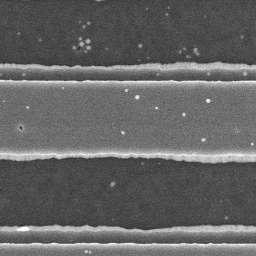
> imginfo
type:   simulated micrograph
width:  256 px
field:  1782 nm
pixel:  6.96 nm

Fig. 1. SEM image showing lines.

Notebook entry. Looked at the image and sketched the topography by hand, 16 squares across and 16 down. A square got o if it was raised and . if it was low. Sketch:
................
................
................
................
ooo.oooooooooooo
oooooooooooooooo
oooooooooooooooo
oooooooooooooooo
oooooooooooooooo
oooooooooooooooo
................
................
................
................
oooooooooooooooo
oooooooooooooooo